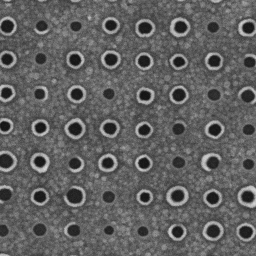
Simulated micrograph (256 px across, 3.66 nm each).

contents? a regular array of holes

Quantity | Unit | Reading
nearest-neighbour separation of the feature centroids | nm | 122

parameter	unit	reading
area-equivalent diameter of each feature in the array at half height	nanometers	44.1